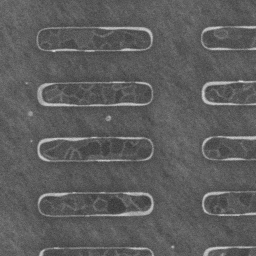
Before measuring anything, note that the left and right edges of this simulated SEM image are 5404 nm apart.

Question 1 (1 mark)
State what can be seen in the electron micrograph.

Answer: groups of lines, slits or small figures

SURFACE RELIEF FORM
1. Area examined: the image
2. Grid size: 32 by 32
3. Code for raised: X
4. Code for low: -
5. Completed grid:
--------------------------------
--------------------------------
--------------------------------
---------------------------XXXXX
-----XXXXXXXXXXXXXX------XXXXXXX
-----XXXXXXXXXXXXXX------XXXXXXX
--------------------------------
--------------------------------
--------------------------------
--------------------------------
------XXXXXXXXXXXX--------XXXXXX
-----XXXXXXXXXXXXXX------XXXXXXX
-----XXXXXXXXXXXXXX-------XXXXXX
--------------------------------
--------------------------------
--------------------------------
--------------------------------
------XXXXXXXXXXXXX-------XXXXXX
-----XXXXXXXXXXXXXX------XXXXXXX
-----XXXXXXXXXXXXXX-------XXXXXX
--------------------------------
--------------------------------
--------------------------------
--------------------------------
------XXXXXXXXXXXXX-------XXXXXX
-----XXXXXXXXXXXXXX------XXXXXXX
-----XXXXXXXXXXXXX--------XXXXXX
--------------------------------
--------------------------------
--------------------------------
--------------------------------
-----XXXXXXXXXXXXXX-------XXXXXX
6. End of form